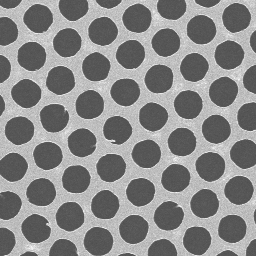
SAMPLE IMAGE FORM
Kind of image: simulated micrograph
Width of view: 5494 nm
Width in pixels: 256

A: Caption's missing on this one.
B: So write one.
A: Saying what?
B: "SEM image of a regular array of holes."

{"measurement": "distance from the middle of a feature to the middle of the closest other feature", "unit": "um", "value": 0.791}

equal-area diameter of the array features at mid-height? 624 nanometers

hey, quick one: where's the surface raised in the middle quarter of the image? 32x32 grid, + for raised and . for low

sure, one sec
+++++.......++.....+++....+++...
..+++......++++++++++......++...
..+++......+++++++++.......++...
...+++.....+++++++++.......+++..
...++++++++++.....++.......+++++
...+++++++++.......++......+++++
..++++.+++++.......++.....++++++
++++.....+++.......++++++++++...
+++.......++.......+++++++++....
+++.......+++.....+++++++++.....
+++.......+++++.++++....+++.....
+++.......+++++++++.......++....
.++......++++++++++.......++....
.++++...+++....++++.......++++..
.+++++++++......+++.......++++++
.+++++++++.......++......+++++++
+++...++++.......++++...++++....
++.....+++.......++++++++++.....
+.......++......++++++++++......
+.......++++...++++....+++......
+.......++++++++++......++......
+.......+++++++++.......++......
++.....++++..++++.......+++.....
+++++++++......++.......++++++++
++++++++.......+++......++++++++
++..++++........+++....+++....++
......++.......++++++++++......+
......++.......++++++++++.......
.......++.....+++++.++++........
.......++++.+++++.....++.......+
......++++++++++.......++......+
.....+++++.++++........+++....++